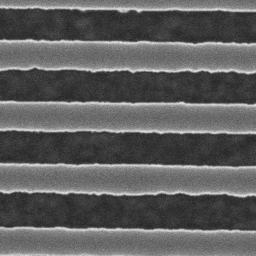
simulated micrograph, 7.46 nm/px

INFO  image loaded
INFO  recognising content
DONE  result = lines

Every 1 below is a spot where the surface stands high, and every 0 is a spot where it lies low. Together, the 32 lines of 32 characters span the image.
11111111111111111111111111111111
00000000000000000000000000000000
00000000000000000000000000000000
00000000000000000000000000000000
00000000000000000000000000000000
11111111111111111111111111111111
11111111111111111111111111111111
11111111111111111111111111111111
11110111111111111111111111111111
00000000000000000000000000000000
00000000000000000000000000000000
00000000000000000000000000000000
00000000000000000000000000000000
11111111111111111111111111111111
11111111111111111111111111111111
11111111111111111111111111111111
00000000000000100111111111111111
00000000000000000000000000000000
00000000000000000000000000000000
00000000000000000000000000000000
00000000000000000000000000000000
11111111111111111111111111111111
11111111111111111111111111111111
11111111111111111111111111111111
00000000000000000000000000000010
00000000000000000000000000000000
00000000000000000000000000000000
00000000000000000000000000000000
11111111000000000000000000000000
11111111111111111111111111111111
11111111111111111111111111111111
11111111111111111111111111111111